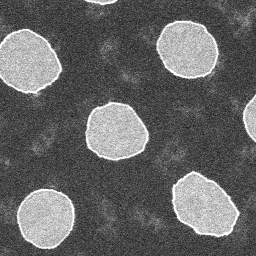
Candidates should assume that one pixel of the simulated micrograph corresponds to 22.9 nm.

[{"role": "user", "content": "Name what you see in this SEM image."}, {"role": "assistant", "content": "raised bodies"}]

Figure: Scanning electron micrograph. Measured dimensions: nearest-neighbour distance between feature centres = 2520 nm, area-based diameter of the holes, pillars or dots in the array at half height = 1330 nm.